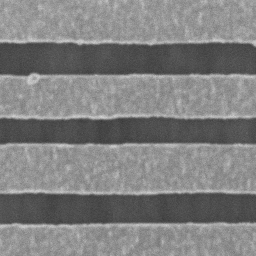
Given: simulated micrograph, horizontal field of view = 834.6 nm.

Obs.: lines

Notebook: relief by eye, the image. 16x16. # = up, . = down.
################
################
################
................
................
################
################
................
................
################
################
################
................
................
################
################